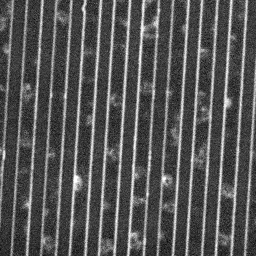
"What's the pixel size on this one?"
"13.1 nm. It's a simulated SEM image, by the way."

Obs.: parallel lines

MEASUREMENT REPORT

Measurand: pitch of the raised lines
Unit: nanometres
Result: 383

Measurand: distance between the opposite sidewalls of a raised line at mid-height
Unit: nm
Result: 210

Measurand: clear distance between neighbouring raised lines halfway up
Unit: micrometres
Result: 0.174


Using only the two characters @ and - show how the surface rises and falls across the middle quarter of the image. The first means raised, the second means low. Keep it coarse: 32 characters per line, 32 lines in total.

@---@@@@----@@@@---@@@@---@@@@--
@---@@@@----@@@----@@@@---@@@@--
@---@@@@---@@@@----@@@@---@@@@--
@---@@@@---@@@@----@@@@---@@@@--
@---@@@@---@@@@----@@@----@@@@--
@---@@@@---@@@@----@@@----@@@@--
@---@@@@---@@@@----@@@----@@@@--
----@@@@---@@@@----@@@----@@@@--
----@@@@---@@@@---@@@@----@@@@--
----@@@@---@@@@---@@@@----@@@@--
----@@@@---@@@@---@@@@----@@@---
----@@@@---@@@@---@@@@----@@@---
----@@@@---@@@@---@@@@----@@@---
---@@@@----@@@@---@@@@---@@@@---
---@@@@----@@@@---@@@@---@@@@---
---@@@@----@@@----@@@@---@@@@---
---@@@@----@@@----@@@@---@@@@---
---@@@@----@@@----@@@@---@@@@---
---@@@@---@@@@----@@@@---@@@@---
---@@@@---@@@@----@@@@---@@@@---
---@@@@---@@@@----@@@@---@@@@---
---@@@@---@@@@----@@@----@@@@---
---@@@@---@@@@----@@@----@@@@---
---@@@@---@@@@----@@@----@@@@---
---@@@@---@@@@---@@@@----@@@@---
---@@@@---@@@@---@@@@----@@@@---
---@@@@---@@@@---@@@@----@@@----
---@@@@---@@@@---@@@@----@@@----
---@@@@---@@@@---@@@@-----@@----
--@@@@----@@@@---@@@@------@----
--@@@@----@@@@---@@@@---@@@@----
--@@@@----@@@@---@@@@---@@@@----